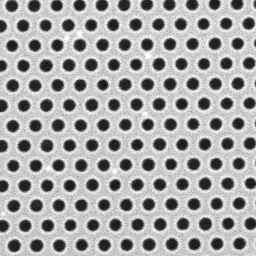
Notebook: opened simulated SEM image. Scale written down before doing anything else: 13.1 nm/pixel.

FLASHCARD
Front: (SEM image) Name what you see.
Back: a regular array of holes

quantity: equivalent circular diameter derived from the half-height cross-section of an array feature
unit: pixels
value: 13.3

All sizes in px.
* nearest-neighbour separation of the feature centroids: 22.4